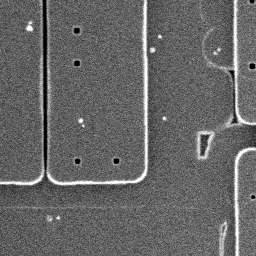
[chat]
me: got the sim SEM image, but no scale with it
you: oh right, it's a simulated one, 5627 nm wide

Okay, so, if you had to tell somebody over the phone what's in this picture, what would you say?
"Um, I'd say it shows wiring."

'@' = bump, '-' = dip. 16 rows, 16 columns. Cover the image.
@@@@@@@@@------@
@@@@@@@@@------@
@@@@@@@@@------@
@@@@@@@@@------@
@@@@@@@@@------@
@@@@@@@@@------@
@@@@@@@@@------@
@@@@@@@@@------@
@@@@@@@@@-------
@@@@@@@@@------@
@@@@@@@@@------@
---------------@
---------------@
---------------@
---------------@
---------------@